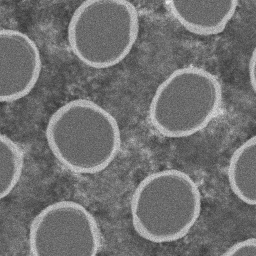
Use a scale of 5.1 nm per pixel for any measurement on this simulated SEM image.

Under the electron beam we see raised bodies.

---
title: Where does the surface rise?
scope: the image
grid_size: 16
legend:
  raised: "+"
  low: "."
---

.....+++...++++.
.....+++....++..
++...+++........
++...+++........
++.........+....
++........++++..
..........++++..
...++++...+++...
...++++.........
+...+++........+
+....+........++
+........+++...+
........++++...+
...+++..++++....
..++++...++.....
..++++.........+